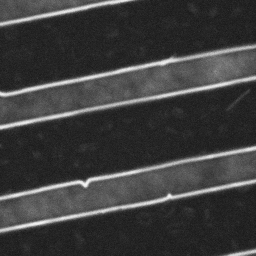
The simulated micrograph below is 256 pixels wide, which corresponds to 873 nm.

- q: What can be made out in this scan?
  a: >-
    one or a few lines or trenches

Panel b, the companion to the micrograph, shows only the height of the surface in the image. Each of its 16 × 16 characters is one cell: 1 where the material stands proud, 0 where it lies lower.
0000011111111111
1111111111111111
1111111111111111
1111111111111000
1111111100000000
1110000000000111
0000000111111111
0011111111111111
1111111111111111
1111111111111110
1111111111000000
1111000000000001
0000000000111111
0000111111111111
1111111111111111
1111111111111111